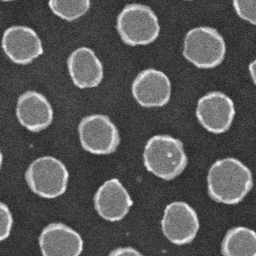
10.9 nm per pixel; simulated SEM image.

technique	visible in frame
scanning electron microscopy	a regular array of raised bodies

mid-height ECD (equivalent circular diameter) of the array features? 409 nanometres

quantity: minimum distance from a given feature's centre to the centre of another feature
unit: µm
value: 0.714